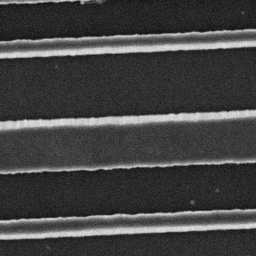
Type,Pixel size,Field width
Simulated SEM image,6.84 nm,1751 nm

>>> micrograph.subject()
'lines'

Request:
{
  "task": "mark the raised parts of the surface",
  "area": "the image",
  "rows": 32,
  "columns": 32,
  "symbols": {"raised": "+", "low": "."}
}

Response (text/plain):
................................
................................
................................
................................
..............++++++++++++++++++
++++++++++++++++++++++++++++++++
+++++++++++.....................
................................
................................
................................
................................
................................
................................
................................
........................++++++++
..++++++++++++++++++++++++++++++
++++++++++++++++++++++++++++++++
++++++++++++++++++++++++++++++++
++++++++++++++++++++++++++++++++
++++++++++++++++++++++++++++++++
++++++++++++++++++++++++++++....
++++............................
................................
................................
................................
................................
.......................+++++++++
..++++++++++++++++++++++++++++++
++++++++++++++++++++++++++......
++++++..........................
................................
................................